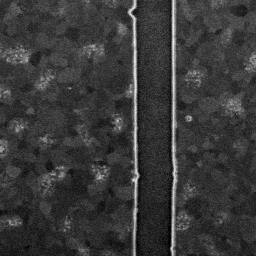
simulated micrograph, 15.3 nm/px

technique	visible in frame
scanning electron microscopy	one or a few lines or trenches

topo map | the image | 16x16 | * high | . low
********...*****
********...*****
********...*****
********...*****
********...*****
********...*****
********...*****
********...*****
********...*****
********...*****
*********..*****
*********..*****
********...*****
********...*****
********...*****
********...*****